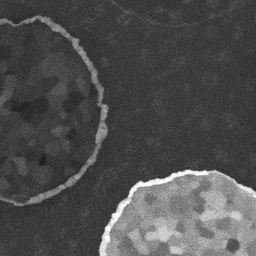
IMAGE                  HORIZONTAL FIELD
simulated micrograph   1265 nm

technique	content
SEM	raised bodies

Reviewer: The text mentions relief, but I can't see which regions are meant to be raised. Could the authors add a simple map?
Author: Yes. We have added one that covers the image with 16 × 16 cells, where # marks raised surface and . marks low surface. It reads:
................
###.............
#####...........
#####...........
######..........
######..........
#######.........
#######.........
######..........
######..........
#####...........
####.....######.
###.....########
.......#########
.......#########
......##########